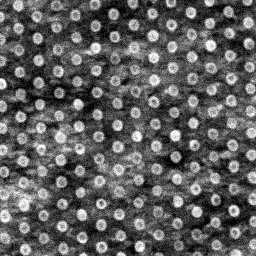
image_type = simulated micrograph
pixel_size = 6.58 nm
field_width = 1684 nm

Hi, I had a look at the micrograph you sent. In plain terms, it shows a regular array of raised bodies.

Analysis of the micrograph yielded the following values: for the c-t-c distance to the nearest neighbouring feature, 75.4 nm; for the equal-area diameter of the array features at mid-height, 64.3 nm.